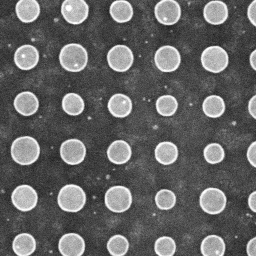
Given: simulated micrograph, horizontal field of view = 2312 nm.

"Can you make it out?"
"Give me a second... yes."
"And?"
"a regular array of raised bodies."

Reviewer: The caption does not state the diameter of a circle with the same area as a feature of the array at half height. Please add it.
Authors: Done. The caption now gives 218 nm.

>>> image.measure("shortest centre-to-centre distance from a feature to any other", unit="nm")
422